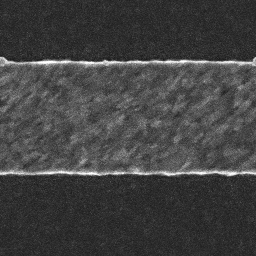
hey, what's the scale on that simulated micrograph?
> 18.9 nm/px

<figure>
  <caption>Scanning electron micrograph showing one or a few lines or trenches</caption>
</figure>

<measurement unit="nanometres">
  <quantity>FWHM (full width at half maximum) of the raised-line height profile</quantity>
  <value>2120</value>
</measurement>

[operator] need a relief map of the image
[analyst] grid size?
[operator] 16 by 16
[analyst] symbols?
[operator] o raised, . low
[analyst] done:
................
................
................
................
oooooooooooooooo
oooooooooooooooo
oooooooooooooooo
oooooooooooooooo
oooooooooooooooo
oooooooooooooooo
oooooooooooooooo
................
................
................
................
................